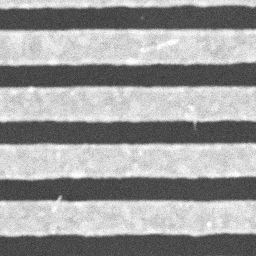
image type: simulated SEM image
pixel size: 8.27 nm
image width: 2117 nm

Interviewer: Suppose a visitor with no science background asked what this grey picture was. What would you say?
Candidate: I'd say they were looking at lines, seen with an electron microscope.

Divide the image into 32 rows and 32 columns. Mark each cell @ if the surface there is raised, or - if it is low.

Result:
@@@@@@@@@@@@@@@@@@@@@@@@@@@@@@@@
--------------------------------
--------------------------------
--------------------------------
@@@@@@@@@@@@@@@@@@@@@@@@@@@@@@@@
@@@@@@@@@@@@@@@@@@@@@@@@@@@@@@@@
@@@@@@@@@@@@@@@@@@@@@@@@@@@@@@@@
@@@@@@@@@@@@@@@@@@@@@@@@@@@@@@@@
--------------------------------
--------------------------------
--------------------------------
@@@@@@@@@@@@@@@@@@@@@@@@@@@@@@@@
@@@@@@@@@@@@@@@@@@@@@@@@@@@@@@@@
@@@@@@@@@@@@@@@@@@@@@@@@@@@@@@@@
@@@@@@@@@@@@@@@@@@@@@@@@@@@@@@@@
--------------------------------
--------------------------------
--------------------------------
@@@@@@@@@@@@@@@@@@@@@@@@@@@@@@@@
@@@@@@@@@@@@@@@@@@@@@@@@@@@@@@@@
@@@@@@@@@@@@@@@@@@@@@@@@@@@@@@@@
@@@@@@@@@@@@@@@@@@@@@@@@@@@@@@@@
---@@---------------------------
--------------------------------
--------------------------------
@@@@@@@@@@@@@@@@@@@@@@@@@@@@@@@@
@@@@@@@@@@@@@@@@@@@@@@@@@@@@@@@@
@@@@@@@@@@@@@@@@@@@@@@@@@@@@@@@@
@@@@@@@@@@@@@@@@@@@@@@@@@@@@@@@@
@@--@-------------------@-------
--------------------------------
--------------------------------